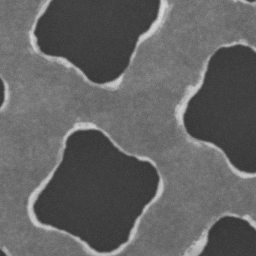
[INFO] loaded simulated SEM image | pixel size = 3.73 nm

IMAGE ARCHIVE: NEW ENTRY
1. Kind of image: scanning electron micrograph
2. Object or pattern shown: holes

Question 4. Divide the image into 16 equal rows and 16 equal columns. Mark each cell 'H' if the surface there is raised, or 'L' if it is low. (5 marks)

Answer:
HHHLLLLLLLHHHHHH
HHLLLLLLLLHHHHHH
HHLLLLLLLHHHHHHH
HHHLLLLLHHHHHLLL
HHHHHLLLHHHHHLLL
HHHHHHHHHHHHLLLL
HHHHHHHHHHHHLLLL
HHHHHHHHHHHLLLLL
HHHHLLLHHHHHLLLL
HHHHLLLLHHHHHHLL
HHHHLLLLLLHHHHHL
HHHLLLLLLLHHHHHH
HHLLLLLLLLHHHHHH
HHLLLLLLLHHHHHHH
HHHHLLLLHHHHHLLL
HHHHHHLLHHHHHLLL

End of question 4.